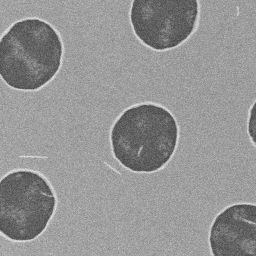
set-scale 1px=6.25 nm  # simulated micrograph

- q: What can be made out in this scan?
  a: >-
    holes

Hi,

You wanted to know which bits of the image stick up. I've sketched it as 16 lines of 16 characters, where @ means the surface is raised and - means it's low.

@@@@@@@@----@@@@
@--@@@@@----@@@@
----@@@@@--@@@@@
----@@@@@@@@@@@@
---@@@@@@@@@@@@@
@-@@@@@@@@@@@@@@
@@@@@@@@@@@@@@@@
@@@@@@@----@@@@@
@@@@@@@----@@@@@
@@@@@@@----@@@@@
@@@@@@@@--@@@@@@
---@@@@@@@@@@@@@
---@@@@@@@@@@@@@
---@@@@@@@@@@@--
---@@@@@@@@@@---
@@@@@@@@@@@@@---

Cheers